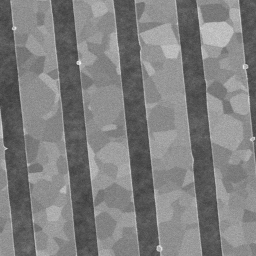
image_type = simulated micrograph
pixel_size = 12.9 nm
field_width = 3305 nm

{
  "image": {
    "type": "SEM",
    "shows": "one or a few lines or trenches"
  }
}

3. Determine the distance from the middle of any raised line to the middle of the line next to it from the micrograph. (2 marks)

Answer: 0.801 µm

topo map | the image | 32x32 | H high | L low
LHHHHHLLLHHHHHLLLHHHHHLLLHHHHHLL
LLHHHHLLLHHHHHLLLHHHHHLLLHHHHHLL
LLHHHHHLLHHHHHLLLHHHHHLLLHHHHHLL
LLHHHHHLLHHHHHHLLHHHHHLLLHHHHHLL
LLHHHHHLLLHHHHHLLHHHHHLLLHHHHHLL
LLHHHHHLLLHHHHHLLHHHHHHLLHHHHHLL
LLHHHHHLLLHHHHHLLLHHHHHLLHHHHHLL
LLHHHHHLLLHHHHHLLLHHHHHLLHHHHHHL
LLHHHHHLLLHHHHHLLLHHHHHLLHHHHHHL
LLHHHHHLLLHHHHHLLLHHHHHLLLHHHHHL
LLHHHHHLLLHHHHHLLLHHHHHLLLHHHHHL
LLHHHHHHLLHHHHHLLLHHHHHLLLHHHHHL
LLLHHHHHLLHHHHHLLLHHHHHLLLHHHHHL
LLLHHHHHLLHHHHHHLLHHHHHLLLHHHHHL
LLLHHHHHLLLHHHHHLLHHHHHLLLHHHHHL
LLLHHHHHLLLHHHHHLLHHHHHHLLHHHHHL
LLLHHHHHLLLHHHHHLLLHHHHHLLHHHHHH
LLLHHHHHLLLHHHHHLLLHHHHHLLHHHHHH
HLLHHHHHLLLHHHHHLLLHHHHHLLHHHHHH
HLLHHHHHLLLHHHHHLLLHHHHHLLLHHHHH
HLLHHHHHLLLHHHHHLLLHHHHHLLLHHHHH
HLLLHHHHHLLHHHHHLLLHHHHHLLLHHHHH
HLLLHHHHHLLHHHHHLLLHHHHHLLLHHHHH
HLLLHHHHHLLHHHHHHLLHHHHHLLLHHHHH
HLLLHHHHHLLLHHHHHLLHHHHHLLLHHHHH
HLLLHHHHHLLLHHHHHLLHHHHHHLLHHHHH
HLLLHHHHHLLLHHHHHLLLHHHHHLLHHHHH
HLLLHHHHHLLLHHHHHLLLHHHHHLLHHHHH
HLLLHHHHHLLLHHHHHLLLHHHHHLLHHHHH
HHLLHHHHHLLLHHHHHLLLHHHHHLLLHHHH
HHLLHHHHHLLLHHHHHLLLHHHHHLLLHHHH
HHLLLHHHHHLLHHHHHLLLHHHHHLLLHHHH